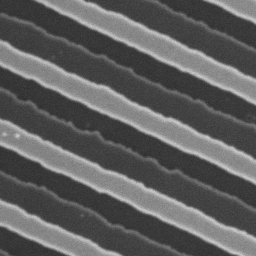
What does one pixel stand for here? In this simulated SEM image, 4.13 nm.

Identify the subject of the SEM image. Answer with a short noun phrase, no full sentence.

lines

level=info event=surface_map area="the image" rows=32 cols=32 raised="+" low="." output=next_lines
.....+++++++...............+++++
.......+++++++...............+++
.........+++++++...............+
...........+++++++..............
..............+++++++...........
+...............+++++++.........
+++...............+++++++.......
+++++...............+++++++.....
.++++++...............+++++++...
...+++++++..............+++++++.
.....+++++++..............++++++
.......+++++++...............+++
.........+++++++...............+
...........++++++++.............
..............++++++............
++..............+++++++.........
+++...............+++++++.......
++++++..............+++++++.....
.+++++++..............+++++++...
...+++++++...............++++++.
.....+++++++...............+++++
.......+++++++...............+++
.........++++++++..............+
............++++++..............
..............+++++++...........
+...............+++++++.........
+++...............+++++++.......
+++++...............+++++++.....
.+++++++..............+++++++...
...+++++++...............++++++.
.....+++++++...............+++++
........++++++...............+++